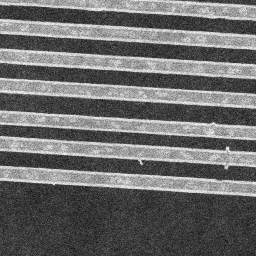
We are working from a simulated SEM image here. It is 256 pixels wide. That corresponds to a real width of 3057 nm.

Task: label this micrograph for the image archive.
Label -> parallel lines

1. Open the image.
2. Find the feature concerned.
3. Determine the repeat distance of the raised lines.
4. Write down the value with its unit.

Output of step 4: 349 nanometers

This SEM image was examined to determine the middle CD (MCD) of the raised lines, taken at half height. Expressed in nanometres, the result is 149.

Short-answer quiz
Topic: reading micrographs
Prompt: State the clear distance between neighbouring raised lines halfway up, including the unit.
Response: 194 nanometers